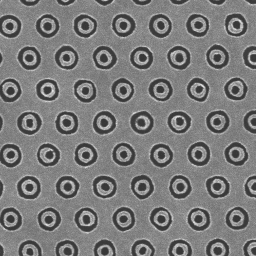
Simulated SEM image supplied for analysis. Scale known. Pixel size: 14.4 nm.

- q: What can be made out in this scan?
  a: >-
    a regular array of ring-shaped grooves with a dot in the middle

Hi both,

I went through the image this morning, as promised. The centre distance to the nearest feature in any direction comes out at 528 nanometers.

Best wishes